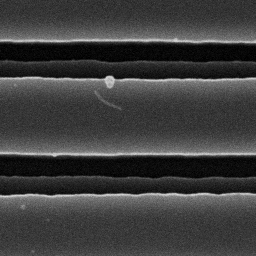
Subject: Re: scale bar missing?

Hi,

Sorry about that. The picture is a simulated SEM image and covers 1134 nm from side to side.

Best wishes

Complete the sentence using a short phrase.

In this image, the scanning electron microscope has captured lines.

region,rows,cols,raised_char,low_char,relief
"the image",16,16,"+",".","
++++++++++++++++
++++++++++++++++
++++++++++++++++
................
................
++++++++++++++++
++++++++++++++++
++++++++++++++++
++++++++++++++++
++++++++++++++++
................
................
++++++++++++++++
++++++++++++++++
++++++++++++++++
++++++++++++++++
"